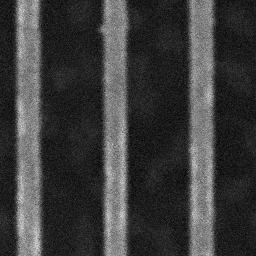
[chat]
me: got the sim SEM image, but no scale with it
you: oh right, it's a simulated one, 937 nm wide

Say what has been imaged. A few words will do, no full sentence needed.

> one or a few lines or trenches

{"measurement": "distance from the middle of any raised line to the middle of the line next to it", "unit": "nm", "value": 316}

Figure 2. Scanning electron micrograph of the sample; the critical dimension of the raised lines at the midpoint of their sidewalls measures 70.4 nm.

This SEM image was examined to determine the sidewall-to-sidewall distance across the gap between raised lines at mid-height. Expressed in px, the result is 67.4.